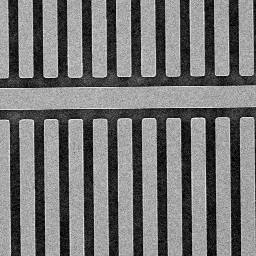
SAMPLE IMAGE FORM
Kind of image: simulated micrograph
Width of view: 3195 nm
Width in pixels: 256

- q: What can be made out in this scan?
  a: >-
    groups of lines, slits or small figures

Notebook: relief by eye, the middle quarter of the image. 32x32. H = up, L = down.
LHHHLLLHHHHLLHHHHLLHHHHLLHHHHLLL
LHHHLLLHHHHLLHHHHLLHHHHLLLHHHLLL
LHHHLLLHHHHLLHHHHLLHHHHLLLHHHLLL
LLLLLLLLLLLLLLLLLLLLLLLLLLLLLLLL
LLLLLLLLLLLLLLLLLLLLLLLLLLLLLLLL
LLLLLLLLLLLLLLLLLLLLLLLLLLLLLLLL
HHHHHHHHHHHHHHHHHHHHHHHHHHHHHHHH
HHHHHHHHHHHHHHHHHHHHHHHHHHHHHHHH
HHHHHHHHHHHHHHHHHHHHHHHHHHHHHHHH
HHHHHHHHHHHHHHHHHHHHHHHHHHHHHHHH
HHHHHHHHHHHHHHHHHHHHHHHHHHHHHHHH
LLLLLLLLLLLLLLLLLLLLLLLLLLLLLLLL
LLLLLLLLLLLLLLLLLLLLLLLLLLLLLLLL
LLLLLLLLLLLLLLLLLLLLLLLLLLLLLLLL
LHHHLLLHHHHLLLHHHLLLHHHLLLHHHLLL
LHHHLLLHHHHLLLHHHLLLHHHLLLHHHLLL
LHHHHLLHHHHLLLHHHLLLHHHLLLHHHLLL
LHHHHLLHHHHLLLHHHLLLHHHLLLHHHLLL
LHHHHLLHHHHLLLHHHLLLHHHLLLHHHLLL
LHHHHLLHHHHLLLHHHLLLHHHLLLHHHLLL
LHHHHLLHHHHLLLHHHLLLHHHLLLHHHLLL
LHHHHLLHHHHLLLHHHLLLHHHLLLHHHLLL
LHHHHLLLHHHLLLHHHLLLHHHLLLHHHLLL
LHHHHLLLHHHLLLHHHLLLHHHLLLHHHLLL
LHHHHLLLHHHLLLHHHLLLHHHLLLHHHLLL
LHHHHLLLHHHLLLHHHLLLHHHLLLHHHLLL
LHHHHLLLHHHLLLHHHLLLHHHLLLHHHLLL
LHHHHLLLHHHLLLHHHLLLHHHLLLHHHLLL
LHHHHLLLHHHLLLHHHLLLHHHLLLHHHLLL
LHHHHLLLHHHLLLHHHLLLHHHLLLHHHLLL
LHHHHLLLHHHLLLHHHLLLHHHLLLHHHLLL
LHHHHLLLHHHLLLHHHLLLHHHLLLHHHLLL